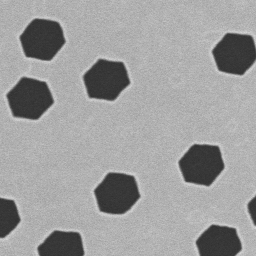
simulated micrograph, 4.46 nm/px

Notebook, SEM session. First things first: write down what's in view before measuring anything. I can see holes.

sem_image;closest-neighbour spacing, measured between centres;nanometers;338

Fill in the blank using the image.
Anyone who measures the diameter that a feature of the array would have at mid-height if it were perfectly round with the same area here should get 191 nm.